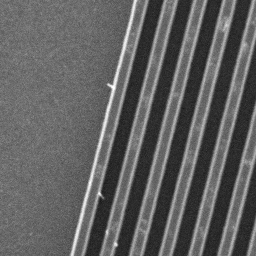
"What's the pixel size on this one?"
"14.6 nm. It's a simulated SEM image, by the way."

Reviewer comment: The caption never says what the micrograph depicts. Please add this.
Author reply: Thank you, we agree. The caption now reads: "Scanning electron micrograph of parallel lines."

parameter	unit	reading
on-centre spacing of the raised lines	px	28.4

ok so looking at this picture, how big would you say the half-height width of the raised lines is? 173 nm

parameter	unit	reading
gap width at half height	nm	247